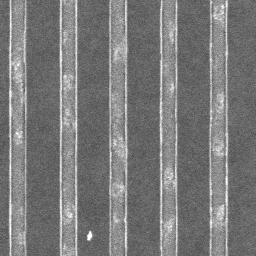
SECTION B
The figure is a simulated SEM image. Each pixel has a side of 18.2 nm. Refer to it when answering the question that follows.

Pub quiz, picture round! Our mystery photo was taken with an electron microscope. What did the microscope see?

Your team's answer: parallel lines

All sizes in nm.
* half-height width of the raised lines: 632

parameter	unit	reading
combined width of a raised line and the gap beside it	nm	912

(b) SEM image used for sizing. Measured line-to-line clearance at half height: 270 nm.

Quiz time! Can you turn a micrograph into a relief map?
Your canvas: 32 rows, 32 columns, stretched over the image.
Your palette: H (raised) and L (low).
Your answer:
HLLHHHHHLLHHHHLLHHHHLLHHHHLLHHHH
HLLHHHHHLLHHHHLLHHHHLLHHHHLLHHHH
HLLHHHHHLLHHHHLLHHHHLLHHHHLLHHHH
HLLHHHHHLLHHHHLLHHHHLLHHHHLLHHHH
HLLHHHHHLLHHHHLLHHHHLLHHHHLLHHHH
HLLHHHHHLLHHHHLLHHHHLLHHHHLLHHHH
HLLHHHHHLLHHHHLLHHHHLLHHHHLLHHHH
HLLHHHHHLLHHHHLLHHHHLLHHHHLLHHHH
HLLHHHHHLLHHHHLLHHHHLLHHHHLLHHHH
HLLHHHHHLLHHHHLLHHHHLLHHHHLLHHHH
HLLHHHHHLLHHHHLLHHHHLLHHHHLLHHHH
HLLHHHHHLLHHHHLLHHHHLLHHHHLLHHHH
HLLHHHHHLLHHHHLLHHHHLLHHHHLLHHHH
HLLHHHHHLLHHHHLLHHHHLLHHHHLLHHHH
HLLHHHHHLLHHHHLLHHHHLLHHHHLLHHHH
HLLHHHHHLLHHHHLLHHHHLLHHHHLLHHHH
HLLHHHHHLLHHHHLLHHHHLLHHHHLLHHHH
HLLHHHHHLLHHHHLLHHHHLLHHHHLLHHHH
HLLHHHHHLLHHHHLLHHHHLLHHHHLLHHHH
HLLHHHHHLLHHHHLLHHHHLLHHHHLLHHHH
HLLHHHHHLLHHHHLLHHHHLLHHHHLLHHHH
HLLHHHHHLLHHHHLLHHHHLLHHHHLLHHHH
HLLHHHHHLLHHHHLLHHHHLLHHHHLLHHHH
HLLHHHHHLLHHHHLLHHHHLLHHHHLLHHHH
HLLHHHHHLLHHHHLLHHHHLLHHHHLLHHHH
HLLHHHHHLLHHHHLLHHHHLLHHHHLLHHHH
HLLHHHHHLLHHHHLLHHHHLLHHHHLLHHHH
HLLHHHHHLLHHHHLLHHHHLLHHHHLLHHHH
HLLHHHHHLLHHHHLLHHHHLLHHHHLLHHHH
HLLHHHHHLLHHHHLLHHHHLLHHHHLLHHHH
HLLHHHHHLLHHHHLLHHHHLLHHHHLLHHHH
HLLHHHHHLLHHHHLLHHHHLLHHHHLLHHHH